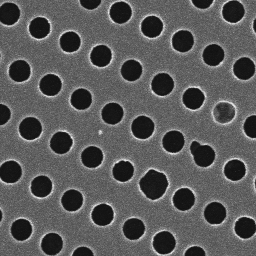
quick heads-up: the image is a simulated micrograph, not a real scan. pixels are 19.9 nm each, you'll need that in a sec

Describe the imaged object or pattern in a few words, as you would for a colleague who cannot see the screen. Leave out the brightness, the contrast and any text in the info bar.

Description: a regular array of holes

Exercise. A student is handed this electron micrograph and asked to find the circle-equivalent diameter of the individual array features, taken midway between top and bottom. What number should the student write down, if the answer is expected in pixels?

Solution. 22.4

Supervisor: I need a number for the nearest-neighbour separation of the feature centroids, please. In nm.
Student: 671